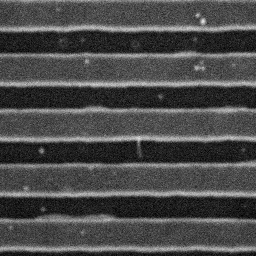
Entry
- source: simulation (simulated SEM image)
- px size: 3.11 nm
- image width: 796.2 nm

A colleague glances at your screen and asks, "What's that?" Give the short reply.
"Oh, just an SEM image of lines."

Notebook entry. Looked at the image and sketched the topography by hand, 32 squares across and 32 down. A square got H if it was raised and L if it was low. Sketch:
HHHHHHHHHHHHHHHHHHHHHHHHHHHHHHHH
HHHHHHHHHHHHHHHHHHHHHHHHHHHHHHHH
HHHHHHHHHHHHHHHHHHHHHHHHHHHHHHHH
HHHHHHHHHHHHHHHHHHHHHHHHHHHHHHHH
LLLLLLLLLLLLLLLLLLLLLLLLLLLLLLLL
LLLLLLLLLLLLLLLLLLLLLLLLLLLLLLLL
LLLLLLLLLLLLLLLLLLLLLLLLLLLLLLLL
HHHHHHHHHHHHHHHHHHHHHHHHHHHHHHHH
HHHHHHHHHHHHHHHHHHHHHHHHHHHHHHHH
HHHHHHHHHHHHHHHHHHHHHHHHHHHHHHHH
HHHHHHHHHHHHHHHHHHHHHHHHHHHHHHHH
LLLLLLLLLLLLLLLLLLLLLLLLLLLLLLLL
LLLLLLLLLLLLLLLLLLLLLLLLLLLLLLLL
LLLLLLLLLLLLLLLLLLLLLLLLLLLLLLLL
HHHHHHHHHHHHHHHHHHHHHHHHHHHHHHHH
HHHHHHHHHHHHHHHHHHHHHHHHHHHHHHHH
HHHHHHHHHHHHHHHHHHHHHHHHHHHHHHHH
HHHHHHHHHHHHHHHLLHLHHHHHHHHLLLLH
LLLLLLLLLLLLLLLLLLLLLLLLLLLLLLLL
LLLLLLLLLLLLLLLLLLLLLLLLLLLLLLLL
LLLLLLLLHHHLLLLLHHHHHLHHHHHHHHHH
HHHHHHHHHHHHHHHHHHHHHHHHHHHHHHHH
HHHHHHHHHHHHHHHHHHHHHHHHHHHHHHHH
HHHHHHHHHHHHHHHHHHHHHHHHHHHHHHHH
LLLLLLLLLLLLLLLLLLLLLLLLLLLLLLLL
LLLLLLLLLLLLLLLLLLLLLLLLLLLLLLLL
LLLLLLLLLLLLLLLLLLLLLLLLLLLLLLLL
HLLLLLLLLLLLLHHHHHHHHHHHHHHHHLLL
HHHHHHHHHHHHHHHHHHHHHHHHHHHHHHHH
HHHHHHHHHHHHHHHHHHHHHHHHHHHHHHHH
HHHHHHHHHHHHHHHHHHHHHHHHHHHHHHHH
LLLLLLLLLLLLLLLLLLLLLLLLLLLLLLLL